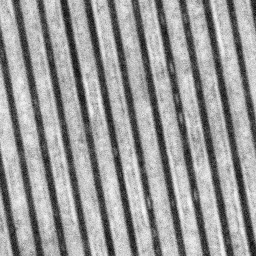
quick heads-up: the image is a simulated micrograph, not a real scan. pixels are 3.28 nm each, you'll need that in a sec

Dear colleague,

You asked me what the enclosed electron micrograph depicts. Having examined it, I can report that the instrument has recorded parallel lines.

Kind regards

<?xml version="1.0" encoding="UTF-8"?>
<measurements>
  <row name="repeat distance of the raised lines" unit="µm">0.0766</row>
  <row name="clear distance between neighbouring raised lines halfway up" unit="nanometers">30.3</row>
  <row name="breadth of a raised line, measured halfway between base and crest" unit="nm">47.2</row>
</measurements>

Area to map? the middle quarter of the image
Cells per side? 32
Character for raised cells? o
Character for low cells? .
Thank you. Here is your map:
oo..oooo..oooo..oooo..ooo...ooo.
oo..oooo..oooo..oooo..oooo..oooo
oo...ooo...ooo..oooo..oooo..oooo
oo...ooo...ooo...ooo...ooo..oooo
ooo..ooo...ooo...ooo...ooo...ooo
ooo..oooo..ooo...oooo..ooo...ooo
ooo..oooo..oooo..oooo..oooo..ooo
ooo..oooo..oooo..oooo..oooo..ooo
ooo...ooo..oooo...ooo...ooo..ooo
ooo...ooo...ooo...ooo...ooo...oo
oooo..oooo..ooo...ooo...ooo...oo
oooo..oooo..oooo..oooo..ooo...oo
.ooo..oooo..oooo..oooo..oooo..oo
.ooo...ooo..oooo..oooo..oooo..oo
.ooo...ooo...ooo...ooo...ooo...o
.oooo..oooo..ooo...ooo...ooo...o
.oooo..oooo..oooo..oooo..ooo...o
..ooo..oooo..oooo..oooo..oooo..o
..ooo...ooo..oooo..oooo..oooo..o
..ooo...ooo...ooo...ooo...ooo..o
..ooo...ooo...ooo...ooo...ooo...
..oooo..oooo..oooo..oooo..ooo...
..oooo..oooo..oooo..oooo..oooo..
...ooo..oooo..oooo..oooo..oooo..
...ooo...ooo...ooo...ooo..oooo..
o..ooo...ooo...ooo...ooo...ooo..
o..oooo..oooo..ooo...ooo...ooo..
o..oooo..oooo..oooo..oooo..ooo..
o...ooo..oooo..oooo..oooo..oooo.
o...ooo...ooo..oooo..oooo..oooo.
oo..ooo...ooo...ooo...ooo...ooo.
oo..oooo..oooo..ooo...ooo...ooo.